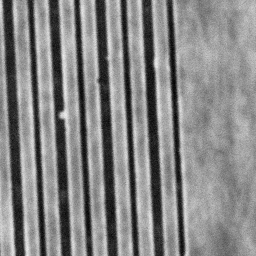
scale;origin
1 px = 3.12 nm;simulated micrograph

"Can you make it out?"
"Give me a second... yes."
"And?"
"parallel lines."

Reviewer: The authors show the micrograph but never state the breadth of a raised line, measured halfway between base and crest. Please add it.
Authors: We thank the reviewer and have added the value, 42.1 nm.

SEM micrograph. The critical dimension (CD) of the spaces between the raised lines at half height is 30.6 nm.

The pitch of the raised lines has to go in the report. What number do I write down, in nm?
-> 72.3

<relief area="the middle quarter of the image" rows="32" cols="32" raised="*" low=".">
***..***....***..***...***..****
***..***....***..***...***..****
***..***....***..***...***..****
***..***....***..***...***..****
***..***....***..***...***...***
***..***....***..***...***...***
***..***....***..***...***...***
***..****...***..***...***...***
***..****...***..***...****..***
***..****...***..***...****..***
****..***...***..***...****..***
****..***...***..***....***..***
****..***...***..***....***..***
.***..***...***..***....***..***
.***..***...***..****...***..***
.***..***...***..****...***..***
.***..***...***...***...***..***
.***..***...****..***...***..***
.***..***...****..***...***..***
.***..***...****..***...***..***
.***..***....***..***...***..***
.***..***....***..***...***..***
.***..***....***..***...***..***
.***..***....***..***...***...**
.***..***....***..***...***...**
.***..***....***..***...***...**
.***..****...***..***...***...**
.***..****...***..***...***...**
.***..****...***..***...****..**
.***...***...***..***...****..**
.****..***...***..***...****..**
.****..***...***..***....***..**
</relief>